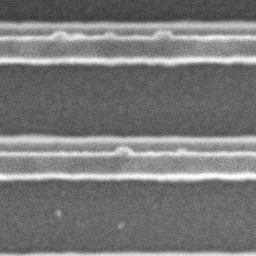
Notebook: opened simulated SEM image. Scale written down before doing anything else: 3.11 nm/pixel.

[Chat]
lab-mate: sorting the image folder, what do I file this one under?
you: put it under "lines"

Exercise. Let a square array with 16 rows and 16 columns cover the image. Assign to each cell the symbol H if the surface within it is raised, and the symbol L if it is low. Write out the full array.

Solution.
LLLLLLLLLLLLLLLL
LLLLLLLLLLLLLLLL
HHHHHHHHHHHHHHHH
HHHHHHHHHHHHHHHH
LLLLLLLLLLLLLLLL
LLLLLLLLLLLLLLLL
LLLLLLLLLLLLLLLL
LLLLLLLLLLLLLLLL
LLLLLLLLLLLLLLLL
HHHHHHHHHHHHHHHH
HHHHHHHHHHHHHHHH
LLLLLLLLLLLLLLLL
LLLLLLLLLLLLLLLL
LLLLLLLLLLLLLLLL
LLLLLLLLLLLLLLLL
LLLLLLLLLLLLLLLL